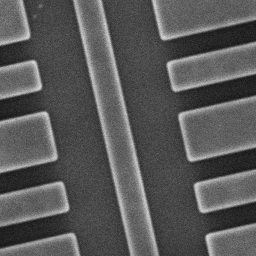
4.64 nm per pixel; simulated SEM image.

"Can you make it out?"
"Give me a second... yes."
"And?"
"groups of lines, slits or small figures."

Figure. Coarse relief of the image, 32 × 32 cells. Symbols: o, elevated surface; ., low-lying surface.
ooo......oooo......ooooooooooooo
ooo.......ooo......ooooooooooooo
ooo.......ooo.......oooooooooooo
oooo......ooo.......ooooooo.....
oooo......oooo......ooo.........
o.........oooo.................o
...........ooo............oooooo
...........ooo........oooooooooo
ooooo......oooo......ooooooooooo
ooooo......oooo......oooooooooo.
ooooo.......ooo......ooooo......
oooo........ooo.................
............ooo...............oo
............oooo.........ooooooo
...ooo......oooo......oooooooooo
oooooo.......ooo.......ooooooooo
oooooo.......ooo.......ooooooooo
ooooooo......oooo......ooooooooo
ooooooo......oooo......ooooooooo
ooooooo.......ooo......oooo.....
ooooo.........ooo...............
o.............ooo..............o
..............oooo........oooooo
....oooo......oooo......oooooooo
oooooooo.......ooo......oooooooo
ooooooooo......ooo.......ooooo..
oooooooo.......oooo......o......
oooo...........oooo.............
................ooo..........ooo
.......oo.......ooo.......oooooo
...ooooooo......oooo......oooooo
oooooooooo......oooo......oooooo